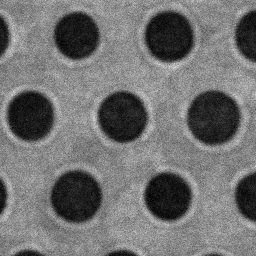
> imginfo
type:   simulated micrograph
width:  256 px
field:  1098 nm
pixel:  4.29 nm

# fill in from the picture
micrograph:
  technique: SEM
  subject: holes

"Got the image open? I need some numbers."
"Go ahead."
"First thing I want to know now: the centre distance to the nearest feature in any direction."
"393 nm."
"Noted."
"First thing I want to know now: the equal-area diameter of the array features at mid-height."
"0.227 micrometres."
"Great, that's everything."